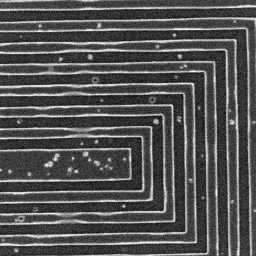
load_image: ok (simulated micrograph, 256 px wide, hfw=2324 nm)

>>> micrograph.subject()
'groups of lines, slits or small figures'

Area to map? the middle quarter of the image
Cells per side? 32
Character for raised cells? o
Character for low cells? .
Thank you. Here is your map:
oooooooooooooooooooooooooooooooo
oooooooooooooooooooooooooooooooo
................................
................................
................................
o.....oooooooooooooooooooooooooo
oooooooooooooooooooooooooooooooo
.....oooooooooooooo...........oo
..............................oo
..............................oo
.............oo.ooooooooooo...oo
ooooooooooooooooooooooooooo...oo
ooooooooooooooooooooooooooo...oo
.........................oo...oo
.........................oo...oo
.........................oo...oo
ooo...oooooooooooooooo...oo...oo
oooooooooooooooooooooo...oo...oo
...................ooo...oo...oo
....................oo...oo....o
....................oo...oo...oo
ooooooooooooooooo...oo...oo...oo
ooooooooooooooooo...oo...oo...oo
ooooooooooooooooo...oo...oo...oo
ooooooooooooooooo...oo...oo...oo
ooooooooooooooooo...oo...oo...oo
ooooooooooooooooo...oo...oo...oo
ooooooooooooooooo...oo...oo...oo
ooooooooooooooooo...oo...oo...oo
....................oo...oo...oo
....................oo...oo....o
....................oo...oo....o